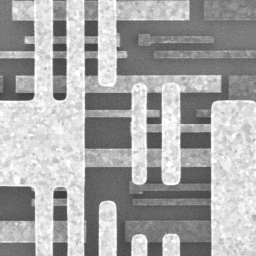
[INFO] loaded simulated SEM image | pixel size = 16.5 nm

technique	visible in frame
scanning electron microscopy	wiring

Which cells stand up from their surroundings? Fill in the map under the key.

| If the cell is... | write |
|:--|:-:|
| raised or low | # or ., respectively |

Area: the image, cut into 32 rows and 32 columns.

....###.##..##..................
....###.##..##..................
....###.##..##..................
....###.##..##..................
....###.##..##..................
....###.##..##..................
....###.##..##..................
....##..##..##..................
....##..##..##..................
....###.##..##..................
....###.##...#.......#..........
....###.##......##..##..........
....###.##......##..##..........
##########......##..##.....#####
##########......##..##.....#####
##########......##..##....######
##########......##..##....######
##########......##..##....######
##########.......#..##.....#####
##########.......#..##.....#####
##########.......#..##.....#####
##########.......#..##.....#####
##########.......#..##.....#####
....###.##................######
....###.##................######
....###.##...#............######
....###.##..##............######
....###.##..##.............#####
....###.##..##.............#####
....###..#..##...#...#.....#####
.....##..#..##..##..##.....#####
.....##.##..##..##..##.....#####